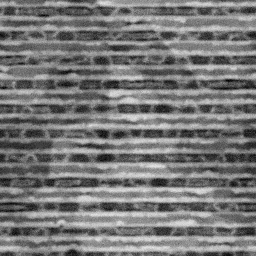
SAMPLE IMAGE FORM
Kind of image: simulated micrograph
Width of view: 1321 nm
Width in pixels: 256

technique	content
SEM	parallel lines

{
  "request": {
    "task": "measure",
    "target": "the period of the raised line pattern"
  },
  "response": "24.4 px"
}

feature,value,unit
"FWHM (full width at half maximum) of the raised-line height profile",67.8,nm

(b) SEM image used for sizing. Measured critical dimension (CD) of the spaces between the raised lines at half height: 58.1 nanometers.